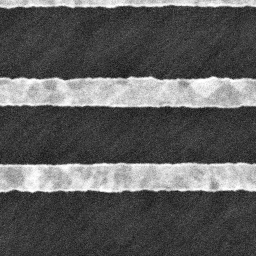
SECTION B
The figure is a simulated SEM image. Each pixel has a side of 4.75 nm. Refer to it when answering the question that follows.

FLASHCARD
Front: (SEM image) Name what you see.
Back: lines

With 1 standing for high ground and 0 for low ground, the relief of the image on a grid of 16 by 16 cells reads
0000000000000000
0000000000000000
0000000000000000
0000000000000000
0000000000000000
1111111111111111
1111111111111111
0000000000000000
0000000000000000
0000000000000000
1111111111111111
1111111111111111
0000000000000000
0000000000000000
0000000000000000
0000000000000000